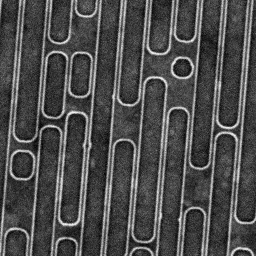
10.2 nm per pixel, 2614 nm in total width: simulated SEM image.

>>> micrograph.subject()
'parallel lines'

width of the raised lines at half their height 47.1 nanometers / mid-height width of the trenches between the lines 209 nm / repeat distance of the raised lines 257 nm